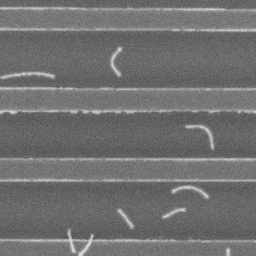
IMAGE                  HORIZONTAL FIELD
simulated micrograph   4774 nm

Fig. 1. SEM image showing lines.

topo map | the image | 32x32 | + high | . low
................................
++++++++++++++++++++++++++++++++
++++++++++++++++++++++++++++++++
++++++++++++++++++++++++++++++++
................................
................................
................................
................................
................................
................................
................................
++++++++++++++++++++++++++++++++
++++++++++++++++++++++++++++++++
++++++++++++++++++++++++++++++++
................................
................................
................................
................................
................................
................................
++++++++++++++++++++++++++++++++
++++++++++++++++++++++++++++++++
++++++++++++++++++++++++++++++++
................................
................................
................................
................................
................................
................................
................................
++++++++++++++++++++++++++++++++
++++++++++++++++++++++++++++++++